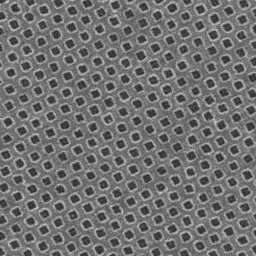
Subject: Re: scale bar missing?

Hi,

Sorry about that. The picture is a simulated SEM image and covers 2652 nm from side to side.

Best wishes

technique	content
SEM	a regular array of holes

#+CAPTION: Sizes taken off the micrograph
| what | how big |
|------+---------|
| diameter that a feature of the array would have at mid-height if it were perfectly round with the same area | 102 nanometers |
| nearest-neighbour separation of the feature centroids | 165 nm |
